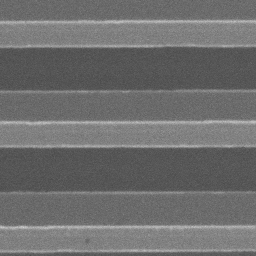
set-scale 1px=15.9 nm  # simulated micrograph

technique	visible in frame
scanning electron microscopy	lines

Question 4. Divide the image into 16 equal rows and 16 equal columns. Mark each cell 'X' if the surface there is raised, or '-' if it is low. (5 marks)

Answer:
XXXXXXXXXXXXXXXX
XXXXXXXXXXXXXXXX
XXXXXXXXXXXXXXXX
----------------
----------------
----------------
XXXXXXXXXXXXXXXX
XXXXXXXXXXXXXXXX
XXXXXXXXXXXXXXXX
----------------
----------------
----------------
XXXXXXXXXXXXXXXX
XXXXXXXXXXXXXXXX
XXXXXXXXXXXXXXXX
XXXXXXXXXXXXXXXX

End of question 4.